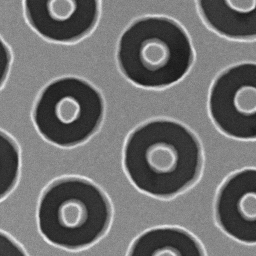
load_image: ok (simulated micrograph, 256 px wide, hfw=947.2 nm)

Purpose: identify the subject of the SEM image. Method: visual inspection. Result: ring-shaped grooves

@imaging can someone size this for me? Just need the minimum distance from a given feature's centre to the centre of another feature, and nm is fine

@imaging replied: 381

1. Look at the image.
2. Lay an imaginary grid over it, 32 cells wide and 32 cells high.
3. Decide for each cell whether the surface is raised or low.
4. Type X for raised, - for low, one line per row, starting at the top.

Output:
XXX---XXX---XXXXXXXXXXXXX----XXX
XXX---XXX---XXXXXXXXXXXXX-----X-
XXXX---X----XXXXXX---XXXXX------
XXXX-------XXXXX-------XXXX-----
XXXXXX----XXXXX--------XXXXX----
XXXXXXXXXXXXXXX---XX----XXXXXXXX
-XXXXXXXXXXXXXX---XXX---XXXXXXXX
-XXXXXXXXXXXXXX---XXX---XXXXXXXX
-XXXXXXXXXXXXXX---------XXXXX---
-XXXXXXXXXXXXXXX-------XXXXX----
XXXXXX-----XXXXXX----XXXXXX-----
XXXXX-------XXXXXXXXXXXXXX----XX
XXXXX---X----XXXXXXXXXXXXX---XXX
XXXXX--XXX---XXXXXXXXXXXXX----XX
XXXX---XXX---XXXXXXXXXXXXXX-----
XXXXX-------XXXXXX----XXXXX-----
XXXXX-------XXXXX-------XXXX----
-XXXXX-----XXXXX---------XXXXXXX
--XXXXXXXXXXXXXX---XX----XXXXXXX
--XXXXXXXXXXXXXX--XXXX---XXXXXXX
--XXXXXXXXXXXXXX---XXX---XXXXXXX
--XXXXXXXXXXXXXX----X----XXXXX--
--XXXXXX--XXXXXXX-------XXXXX---
-XXXXX------XXXXXX-----XXXXX----
XXXXXX-------XXXXXXXXXXXXXX---XX
XXXXX---XX----XXXXXXXXXXXXX---XX
XXXXX--XXXX---XXXXXXXXXXXXX---XX
XXXXX---XX----XXXXXXXXXXXXX-----
XXXXX--------XXXXXXXXXXXXXXX----
-XXXXX------XXXXXX------XXXXX---
--XXXXX----XXXXXX--------XXXXXXX
---XXXXXXXXXXXXX----XX---XXXXXXX